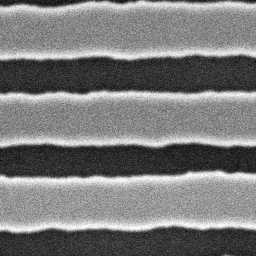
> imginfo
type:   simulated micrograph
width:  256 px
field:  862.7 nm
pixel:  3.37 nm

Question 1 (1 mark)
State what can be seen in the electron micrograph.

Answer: lines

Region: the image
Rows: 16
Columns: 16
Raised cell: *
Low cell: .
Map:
****************
****************
****************
***********.....
................
................
****************
****************
****************
................
................
****************
****************
****************
................
................